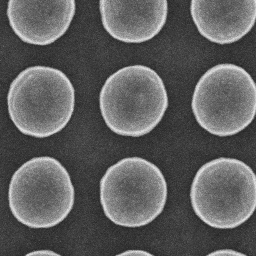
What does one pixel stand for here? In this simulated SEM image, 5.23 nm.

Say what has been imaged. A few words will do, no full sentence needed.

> raised bodies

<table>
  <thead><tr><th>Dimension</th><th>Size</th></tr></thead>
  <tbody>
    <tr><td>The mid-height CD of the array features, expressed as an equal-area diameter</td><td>350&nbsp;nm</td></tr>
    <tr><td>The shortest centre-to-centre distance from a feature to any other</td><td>0.48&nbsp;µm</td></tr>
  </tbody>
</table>